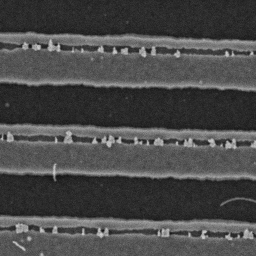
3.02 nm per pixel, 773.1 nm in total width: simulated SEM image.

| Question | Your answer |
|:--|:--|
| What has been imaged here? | lines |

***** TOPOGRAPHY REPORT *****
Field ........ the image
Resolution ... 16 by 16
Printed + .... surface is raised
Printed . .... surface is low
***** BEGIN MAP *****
................
................
+++++++++++++...
++++++++++++++++
++++++++++++++++
..............++
................
................
++++++++++++++++
++++++++++++++++
++++++++++++++++
................
................
................
++++++++++++++++
++++++++++++++++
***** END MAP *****